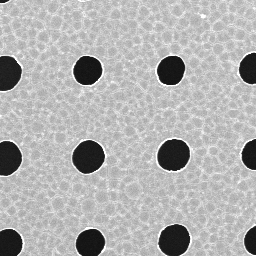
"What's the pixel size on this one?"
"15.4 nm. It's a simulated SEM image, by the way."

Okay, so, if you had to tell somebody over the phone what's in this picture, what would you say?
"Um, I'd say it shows holes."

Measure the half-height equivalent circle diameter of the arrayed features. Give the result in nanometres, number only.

477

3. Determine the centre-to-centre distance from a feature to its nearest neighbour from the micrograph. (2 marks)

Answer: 1.29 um